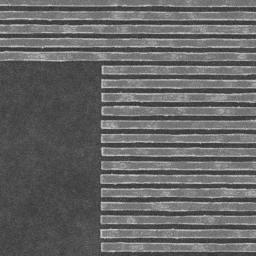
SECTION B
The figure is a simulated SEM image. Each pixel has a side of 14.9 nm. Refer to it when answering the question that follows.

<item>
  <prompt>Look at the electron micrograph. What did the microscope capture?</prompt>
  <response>parallel lines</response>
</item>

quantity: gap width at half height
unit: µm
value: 0.0765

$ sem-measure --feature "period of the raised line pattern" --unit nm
203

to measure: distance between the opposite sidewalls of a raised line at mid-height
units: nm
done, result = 127